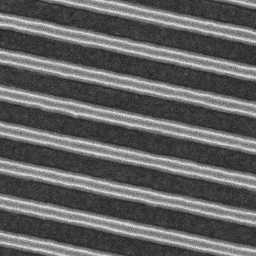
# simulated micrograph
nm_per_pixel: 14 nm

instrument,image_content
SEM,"parallel lines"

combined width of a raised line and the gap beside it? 497 nm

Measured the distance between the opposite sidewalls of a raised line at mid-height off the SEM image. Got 169 nm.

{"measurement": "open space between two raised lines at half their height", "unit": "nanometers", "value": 325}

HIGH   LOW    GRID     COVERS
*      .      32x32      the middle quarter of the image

***............................*
********........................
************....................
...**************...............
........**************..........
............***************.....
.................**************.
......................**********
...........................*****
***............................*
******..........................
***********.....................
..**************................
......***************...........
...........***************......
................***************.
.....................***********
..........................******
**.............................*
*******.........................
***********.....................
..**************................
......**************............
...........***************......
................**************..
.....................***********
..........................******
*.............................**
*******.........................
***********.....................
.***************................
......**************............